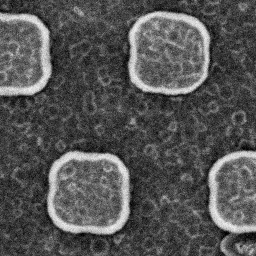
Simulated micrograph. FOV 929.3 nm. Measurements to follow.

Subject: raised bodies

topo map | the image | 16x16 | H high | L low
LLLLLLLLLLLLLLLL
HHLLLLLLLHHHLLLL
HHHLLLLLHHHHHLLL
HHHLLLLLHHHHHLLL
HHHLLLLLHHHHHLLL
HHLLLLLLLHHHLLLL
LLLLLLLLLLLLLLLL
LLLLLLLLLLLLLLLL
LLLLLLLLLLLLLLLL
LLLLLLLLLLLLLLLL
LLLHHHHHLLLLLHHH
LLLHHHHHLLLLLHHH
LLLHHHHHLLLLLHHH
LLLHHHHHLLLLLHHH
LLLLLLLLLLLLLLLL
LLLLLLLLLLLLLLLL